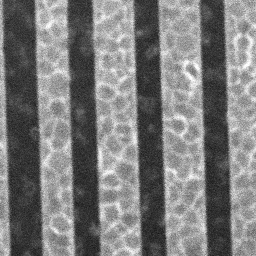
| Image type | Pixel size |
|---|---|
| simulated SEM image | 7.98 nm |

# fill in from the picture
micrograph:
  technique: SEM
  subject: one or a few lines or trenches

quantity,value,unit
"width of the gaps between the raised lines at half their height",217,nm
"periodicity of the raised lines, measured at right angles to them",507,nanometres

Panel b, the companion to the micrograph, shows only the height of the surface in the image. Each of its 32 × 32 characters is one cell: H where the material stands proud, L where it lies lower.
LLLLLHHHLLLLHHHHHLLLHHHHHLLLHHHH
LLLLLHHHLLLLHHHHHLLLHHHHHLLLHHHH
LLLLLHHHLLLLHHHHHLLLHHHHHLLLHHHH
LLLLLHHHLLLLHHHHHLLLHHHHHLLLHHHH
LLLLLHHHLLLLHHHHHLLLHHHHHLLLHHHH
LLLLLHHHLLLLHHHHHLLLHHHHHLLLHHHH
LLLLLHHHLLLLHHHHHLLLHHHHHLLLHHHH
LLLLLHHHLLLLHHHHHLLLHHHHHLLLHHHH
LLLLLHHHLLLLHHHHHLLLHHHHHLLLHHHH
LLLLLHHHHLLLHHHHHLLLHHHHHLLLLHHH
HLLLLHHHHLLLHHHHHLLLHHHHHLLLLHHH
HLLLLHHHHLLLHHHHHLLLHHHHHLLLLHHH
HLLLLHHHHLLLHHHHHLLLHHHHHLLLLHHH
HLLLLHHHHLLLHHHHHLLLHHHHHLLLLHHH
HLLLLHHHHLLLHHHHHLLLHHHHHLLLLHHH
HLLLLHHHHLLLHHHHHLLLHHHHHLLLLHHH
HLLLLHHHHLLLHHHHHLLLHHHHHLLLLHHH
HLLLLHHHHLLLHHHHHLLLHHHHHLLLLHHH
HLLLLHHHHLLLHHHHHLLLLHHHHLLLLHHH
HLLLLHHHHLLLHHHHHLLLLHHHHLLLLHHH
HLLLLHHHHLLLHHHHHLLLLHHHHLLLLHHH
HLLLLHHHHLLLHHHHHLLLLHHHHLLLLHHH
HLLLLHHHHLLLHHHHHLLLLHHHHLLLLHHH
HLLLLHHHHLLLHHHHHLLLLHHHHLLLLHHH
HLLLLHHHHLLLLHHHHLLLLHHHHLLLLHHH
HLLLLHHHHLLLLHHHHLLLLHHHHHLLLHHH
HLLLLHHHHLLLLHHHHLLLLHHHHHLLLHHH
HLLLLHHHHLLLLHHHHLLLLHHHHHLLLHHH
HLLLLHHHHLLHHHHHHLLLLHHHHHLLLHHH
HLLLLHHHHLLLLHHHHLLLLHHHHHLLLHHH
HLLLLHHHHLLLLHHHHHLLLHHHHHLLLHHH
HLLLLHHHHLLLLHHHHHLLLHHHHHLLLHHH